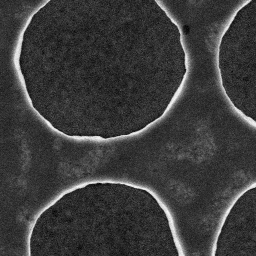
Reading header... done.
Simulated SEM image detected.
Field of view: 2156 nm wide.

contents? holes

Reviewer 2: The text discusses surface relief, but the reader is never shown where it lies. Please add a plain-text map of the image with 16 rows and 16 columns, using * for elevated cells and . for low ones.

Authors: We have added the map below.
***.......*****.
**.........***..
*..........***..
*...........**..
*...........**..
**.........***..
**.........****.
***.......******
****...*********
****************
****************
******.*********
****......*****.
***.......****..
**.........***..
**.........**...